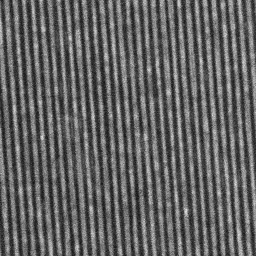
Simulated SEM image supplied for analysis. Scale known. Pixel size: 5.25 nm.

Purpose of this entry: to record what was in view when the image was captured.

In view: parallel lines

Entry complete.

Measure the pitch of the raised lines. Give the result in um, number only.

0.0452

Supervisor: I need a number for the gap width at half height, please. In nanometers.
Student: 28.1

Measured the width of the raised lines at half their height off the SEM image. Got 0.0183 um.